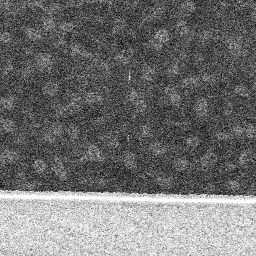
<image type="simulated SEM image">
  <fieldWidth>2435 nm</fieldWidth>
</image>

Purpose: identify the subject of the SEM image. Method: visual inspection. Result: one or a few lines or trenches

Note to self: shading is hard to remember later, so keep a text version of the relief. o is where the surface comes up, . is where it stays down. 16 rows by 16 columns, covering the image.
................
................
................
................
................
................
................
................
................
................
................
................
ooooooooo.......
oooooooooooooooo
oooooooooooooooo
oooooooooooooooo